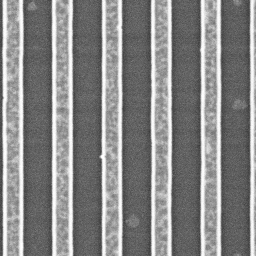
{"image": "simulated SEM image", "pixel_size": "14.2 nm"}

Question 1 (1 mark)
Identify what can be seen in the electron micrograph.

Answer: parallel lines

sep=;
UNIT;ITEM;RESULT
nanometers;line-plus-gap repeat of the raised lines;704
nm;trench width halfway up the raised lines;469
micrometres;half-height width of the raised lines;0.234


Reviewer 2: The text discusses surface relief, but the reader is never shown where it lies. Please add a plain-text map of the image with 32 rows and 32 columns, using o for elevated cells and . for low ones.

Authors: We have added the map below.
.oo....oo....oo....oo....oo.....
.oo....oo....oo....oo....oo.....
.oo....oo....oo....oo....oo.....
.oo....oo....oo....oo....oo.....
.oo....oo....oo....oo....oo.....
.oo....oo....oo....oo....oo.....
.oo....oo....oo....oo....oo.....
.oo....oo....oo....oo....oo.....
.oo....oo....oo....oo....oo.....
.oo....oo....oo....oo....oo.....
.oo....oo....oo....oo....oo.....
.oo....oo....oo....oo....oo.....
.oo....oo....oo....oo....oo.....
.oo....oo....oo....oo....oo.....
.oo....oo....oo....oo....oo.....
.oo....oo....oo....oo....oo.....
.oo....oo....oo....oo....oo.....
.oo....oo....oo....oo....oo.....
.oo....oo....oo....oo....oo.....
.oo....oo....oo....oo....oo.....
.oo....oo....oo....oo....oo.....
.oo....oo....oo....oo....oo.....
.oo....oo....oo....oo....oo.....
.oo....oo....oo....oo....oo.....
.oo....oo....oo....oo....oo.....
.oo....oo....oo....oo....oo.....
.oo....oo....oo....oo....oo.....
.oo....oo....oo....oo....oo.....
.oo....oo....oo....oo....oo.....
.oo....oo....oo....oo....oo.....
.oo....oo....oo....oo....oo.....
.oo....oo....oo....oo....oo.....